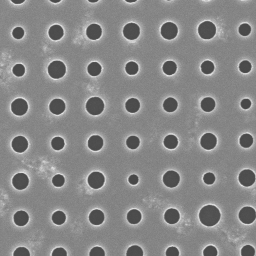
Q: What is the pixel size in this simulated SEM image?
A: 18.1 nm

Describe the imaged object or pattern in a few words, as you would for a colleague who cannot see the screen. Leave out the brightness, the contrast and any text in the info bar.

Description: a regular array of holes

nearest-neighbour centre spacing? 670 nanometers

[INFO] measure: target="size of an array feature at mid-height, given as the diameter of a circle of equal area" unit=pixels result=15.3